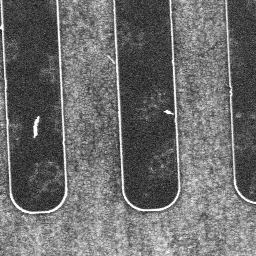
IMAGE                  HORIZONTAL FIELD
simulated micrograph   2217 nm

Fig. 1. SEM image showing one or a few lines or trenches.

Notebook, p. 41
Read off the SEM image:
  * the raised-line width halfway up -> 493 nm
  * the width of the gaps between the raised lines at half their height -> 484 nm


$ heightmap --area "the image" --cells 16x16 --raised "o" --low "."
oooo...oooo...oo
oooo...oooo...oo
oooo...oooo...oo
oooo...oooo...oo
oooo...oooo...oo
oooo...oooo...oo
oooo...oooo...oo
oooo...oooo...oo
oooo....ooo....o
oooo....ooo....o
.ooo....ooo....o
.ooo....ooo....o
.ooo....ooo....o
................
................
................